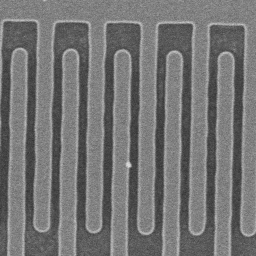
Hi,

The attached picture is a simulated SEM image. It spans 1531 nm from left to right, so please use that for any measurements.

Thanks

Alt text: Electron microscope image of groups of lines, slits or small figures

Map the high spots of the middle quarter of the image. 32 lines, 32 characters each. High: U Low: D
UUUUDDUUUUDDDUUUUDDUUUUDDDUUUUDD
UUUUDDUUUUDDDUUUUDDUUUUDDDUUUUDD
UUUUDDUUUUDDDUUUUDDUUUUDDDUUUUDD
UUUUDDUUUUDDDUUUUDDUUUUDDDUUUUDD
UUUUDDUUUUDDDUUUUDDUUUUDDUUUUUDD
UUUUDDUUUUDDDUUUDDDUUUUDDUUUUUDD
UUUUDDUUUUDDDUUUDDDUUUUDDUUUUDDD
UUUUDDUUUUDDDUUUDDDUUUUDDUUUUDDD
UUUUDDUUUUDDDUUUDDDUUUUDDUUUUDDD
UUUUDDUUUUDDDUUUDDDUUUUDDUUUUDDD
UUUUDDUUUUDDUUUUDDDUUUUDDUUUUDDD
UUUUDDUUUUDDUUUUDDDUUUUDDUUUUDDD
UUUDDDUUUUDDUUUUDDDUUUUDDUUUUDDD
UUUDDDUUUUDDDUUUDDDUUUUDDUUUUDDD
UUUDDDUUUUDDDUUUDDDUUUUDDUUUUDDD
UUUDDDUUUUDDDUUUDDDUUUUDDUUUUDDD
UUUDDDUUUUDDUUUUDDDUUUUDDUUUUDDD
UUUDDDUUUUDDUUUUDDDUUUUDDUUUUDDD
UUUDDDUUUUDDUUUUDDDUUUUDDUUUUDDD
UUUDDDUUUUDDUUUUDDDUUUUDDUUUUDDD
UUUDDDUUUUDDUUUUDDDUUUUDDUUUUDDD
UUUDDDUUUUDDUUUUDDDUUUUDDUUUUDDD
UUUDDDUUUUDDUUUUDDDUUUUDDUUUUDDD
UUUDDDUUUUDDUUUUDDDUUUUDDUUUUDDD
UUUDDDUUUUDDUUUUDDDUUUUDDUUUUDDD
UUUDDDUUUUDDUUUUDDDUUUUDDUUUUDDD
UUUDDDUUUUDDUUUUDDDUUUUDDUUUUDDD
UUUDDDUUUUDDUUUUDDDUUUUDDUUUUDDD
UUUDDDUUUUDDUUUUDDDUUUUDDUUUUDDD
UUUDDDUUUUDDUUUUDDDUUUUDDUUUUDDD
UUUDDDUUUUDDUUUUDDDUUUDDDUUUUDDD
UUUDDDUUUUDDUUUUDDDUUUUDDUUUUDDD